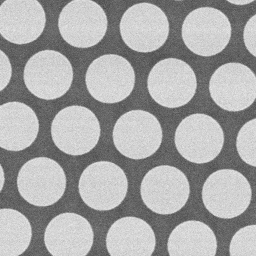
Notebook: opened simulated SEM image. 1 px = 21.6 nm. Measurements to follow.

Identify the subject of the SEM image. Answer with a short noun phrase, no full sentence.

an array of small figures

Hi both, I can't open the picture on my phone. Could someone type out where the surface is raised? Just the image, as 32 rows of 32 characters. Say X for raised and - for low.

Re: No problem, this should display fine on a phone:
XXXXX----XXX-----XX-----------X-
XXXXX---XXXXX---XXXX----XXXX----
XXXXXX-XXXXXX--XXXXXX--XXXXX---X
XXXXX--XXXXXX--XXXXXX--XXXXXX--X
XXXXX---XXXXX--XXXXXX--XXXXXX--X
---------XXX----XXXX---XXXXX---X
-----XX-----------------XXX----X
X---XXXX----XXXX----XX----------
X--XXXXXX--XXXXXX--XXXXX---XXXX-
X--XXXXXX--XXXXXX--XXXXX---XXXXX
X--XXXXXX--XXXXXX--XXXXXX-XXXXXX
----XXXX---XXXXX---XXXXX--XXXXXX
------------XXX----XXXXX---XXXXX
XXXX----XXX-----------------XXX-
XXXX---XXXXX---XXXX-----XX------
XXXXX--XXXXX--XXXXXX---XXXX----X
XXXXX-XXXXXX--XXXXXX--XXXXXX--XX
XXXX---XXXXX--XXXXXX--XXXXXX--XX
XXX----XXXXX---XXXXX--XXXXXX--XX
----------------XXX----XXXX---XX
---XXXX-----XX-----------------X
--XXXXXX--XXXXX----XXXX----XXX--
--XXXXXX--XXXXXX--XXXXX---XXXXX-
--XXXXXX--XXXXXX--XXXXXX-XXXXXX-
---XXXXX--XXXXXX--XXXXXX-XXXXXX-
----XX-----XXXX---XXXXX---XXXXX-
XX-----------------XXX----XXXX--
XXX----XXXX----XXX--------------
XXXX--XXXXX---XXXXX---XXXX----XX
XXXX--XXXXXX-XXXXXX--XXXXXX--XXX
XXXX--XXXXXX-XXXXXX--XXXXXX--XXX
XXX---XXXXX---XXXXX--XXXXXX--XXX